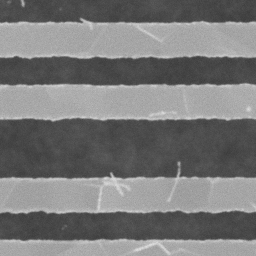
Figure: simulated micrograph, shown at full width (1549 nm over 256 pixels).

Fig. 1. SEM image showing lines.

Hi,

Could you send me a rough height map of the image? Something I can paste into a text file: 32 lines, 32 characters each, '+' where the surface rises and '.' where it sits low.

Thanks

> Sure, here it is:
................................
................................
................................
++++++++++++++++++++++++++++++++
++++++++++++++++++++++++++++++++
++++++++++++++++++++++++++++++++
++++++++++++++++++++++++++++++++
................................
................................
................................
................................
++++++++++++++++++++++++++++++++
++++++++++++++++++++++++++++++++
++++++++++++++++++++++++++++++++
++++++++++++++++++++++++++++++++
................................
................................
................................
................................
................................
................................
................................
++++++++++++++++++++++++++++++++
++++++++++++++++++++++++++++++++
++++++++++++++++++++++++++++++++
++++++++++++++++++++++++++++++++
.+++..++...+...........+........
................................
................................
................................
++++++++++++++++++++++++++++++++
++++++++++++++++++++++++++++++++